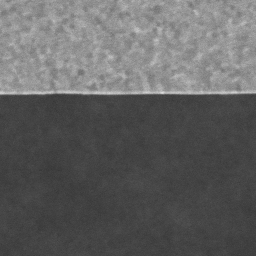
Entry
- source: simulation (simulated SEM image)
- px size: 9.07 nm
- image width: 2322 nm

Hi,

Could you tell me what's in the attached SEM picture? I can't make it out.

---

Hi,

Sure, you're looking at wiring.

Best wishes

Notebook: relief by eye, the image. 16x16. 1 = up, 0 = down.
1111111111111111
1111111111111111
1111111111111111
1111111111111111
1111111111111111
1111111111111111
0000000000000000
0000000000000000
0000000000000000
0000000000000000
0000000000000000
0000000000000000
0000000000000000
0000000000000000
0000000000000000
0000000000000000